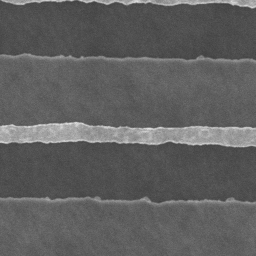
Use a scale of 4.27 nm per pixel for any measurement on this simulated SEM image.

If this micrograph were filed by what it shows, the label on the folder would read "lines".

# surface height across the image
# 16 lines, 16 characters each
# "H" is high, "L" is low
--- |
LLLLLLLLLLLLLLLL
LLLLLLLLLLLLLLLL
LLLLLLLLLLLLLLLL
HHLLLLLLLLLLLLLL
HHHHHHHHHHHHHHHH
HHHHHHHHHHHHHHHH
HHHHHHHHHHHHHHHH
HHHHHHHHHHHHHHHH
HHHHHHHHHHHHHHHH
LLLLLLLLLLLLLLLL
LLLLLLLLLLLLLLLL
LLLLLLLLLLLLLLLL
HHHHHHHLHLLLLLHL
HHHHHHHHHHHHHHHH
HHHHHHHHHHHHHHHH
HHHHHHHHHHHHHHHH